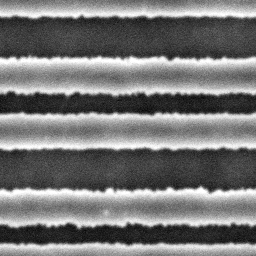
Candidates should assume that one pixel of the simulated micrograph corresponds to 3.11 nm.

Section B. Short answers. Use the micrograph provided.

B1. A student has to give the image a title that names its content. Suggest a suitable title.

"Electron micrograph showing lines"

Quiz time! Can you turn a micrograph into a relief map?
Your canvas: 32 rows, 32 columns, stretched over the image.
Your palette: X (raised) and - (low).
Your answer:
XXXXXXXXXXXXXXXXXXXXXXXXXXXXXXXX
XXXXXXXXXXXXXXXXXXXXXXXXXXXXXXXX
--------------------------------
--------------------------------
--------------------------------
--------------------------------
--------------------------------
XXXXXXXXXXXXXXXXXXXXX-XX-XXXXXXX
XXXXXXXXXXXXXXXXXXXXXXXXXXXXXXXX
XXXXXXXXXXXXXXXXXXXXXXXXXXXXXXXX
XXXXXXXXXXXXXXXXXXXXXXXXXXXXXXXX
X-XXXXXXX-XXXXXXXXXXXXXXXXXXXXXX
--------------------------------
--------------------------------
XXXXXXXXXXXXXXXXXXXXXXXXXXXXXXXX
XXXXXXXXXXXXXXXXXXXXXXXXXXXXXXXX
XXXXXXXXXXXXXXXXXXXXXXXXXXXXXXXX
XXXXXXXXXXXXXXXXXXXXXXXXXXXXXXXX
XXXXXXX-XXXX--XXX--X-XX-XXX--X-X
--------------------------------
--------------------------------
--------------------------------
--------------------------------
--------------------------------
XXXXXXXXXXXXXXXXXXXXXXXXXXXXXXXX
XXXXXXXXXXXXXXXXXXXXXXXXXXXXXXXX
XXXXXXXXXXXXXXXXXXXXXXXXXXXXXXXX
XXXXXXXXXXXXXXXXXXXXXXXXXXXXXXXX
--------------------------------
--------------------------------
--------------------------------
XXXXXXXXXXXXXXXXXXXXXXXXXXXXXXXX